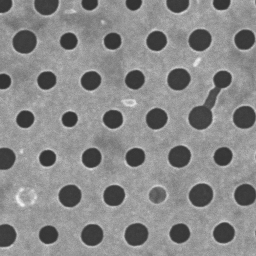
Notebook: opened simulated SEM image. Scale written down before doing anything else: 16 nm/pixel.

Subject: a regular array of holes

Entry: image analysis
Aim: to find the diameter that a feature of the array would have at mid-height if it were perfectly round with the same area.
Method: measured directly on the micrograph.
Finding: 333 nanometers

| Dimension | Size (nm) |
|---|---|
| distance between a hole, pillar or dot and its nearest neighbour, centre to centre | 698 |